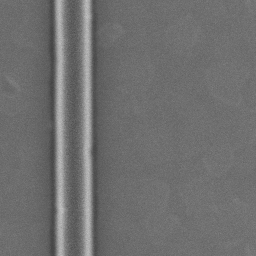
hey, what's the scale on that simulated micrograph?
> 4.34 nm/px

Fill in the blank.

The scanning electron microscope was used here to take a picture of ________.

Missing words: one or a few lines or trenches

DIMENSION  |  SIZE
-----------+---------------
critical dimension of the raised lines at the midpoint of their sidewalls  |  134 nanometers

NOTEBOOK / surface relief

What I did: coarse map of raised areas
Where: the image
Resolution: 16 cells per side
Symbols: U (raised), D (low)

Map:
DDDDUUDDDDDDDDDD
DDDDUUDDDDDDDDDD
DDDDUUDDDDDDDDDD
DDDDUUDDDDDDDDDD
DDDDUUDDDDDDDDDD
DDDDUUDDDDDDDDDD
DDDDUUDDDDDDDDDD
DDDDUUDDDDDDDDDD
DDDDUUDDDDDDDDDD
DDDDUUDDDDDDDDDD
DDDDUUDDDDDDDDDD
DDDDUUDDDDDDDDDD
DDDDUUDDDDDDDDDD
DDDDUUDDDDDDDDDD
DDDDUUDDDDDDDDDD
DDDDUUDDDDDDDDDD